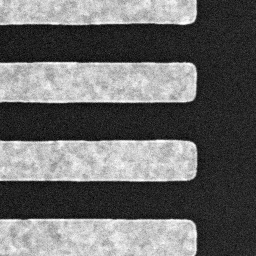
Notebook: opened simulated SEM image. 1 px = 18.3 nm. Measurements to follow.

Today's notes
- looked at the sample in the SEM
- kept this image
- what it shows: wiring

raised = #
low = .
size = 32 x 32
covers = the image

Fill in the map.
########################........
########################........
########################........
................................
................................
................................
................................
................................
########################........
########################........
########################........
########################........
########################........
................................
................................
................................
................................
................................
########################........
#########################.......
#########################.......
########################........
########################........
................................
................................
................................
................................
...############.................
########################........
########################........
########################........
########################........